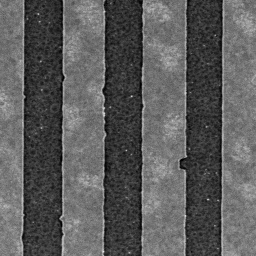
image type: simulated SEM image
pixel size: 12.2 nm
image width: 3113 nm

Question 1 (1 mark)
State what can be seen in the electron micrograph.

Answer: one or a few lines or trenches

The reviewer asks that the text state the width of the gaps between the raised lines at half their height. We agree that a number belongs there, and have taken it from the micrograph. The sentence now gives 476 nm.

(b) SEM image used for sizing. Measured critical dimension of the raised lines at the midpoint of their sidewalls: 508 nm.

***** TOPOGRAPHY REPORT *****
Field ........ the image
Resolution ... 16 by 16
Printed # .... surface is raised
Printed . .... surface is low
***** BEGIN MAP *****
#...###..###..##
#...###..###..##
#...##...###..##
#...###..###..##
#...###..###..##
#...##...###..##
#...##...###..##
#...###..###..##
#...###..###..##
#...###..###..##
#...###..##...##
#...##...###..##
#...##...###..##
#...##...###..##
#...###..###..##
#...##...###..##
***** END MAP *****